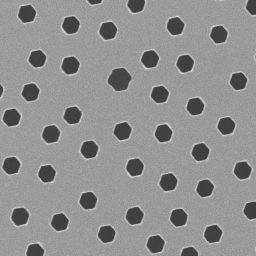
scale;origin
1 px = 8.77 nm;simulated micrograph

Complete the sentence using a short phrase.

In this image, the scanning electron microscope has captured a regular array of holes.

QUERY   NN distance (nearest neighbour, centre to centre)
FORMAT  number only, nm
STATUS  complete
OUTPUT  320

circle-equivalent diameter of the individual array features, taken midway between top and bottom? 0.154 um